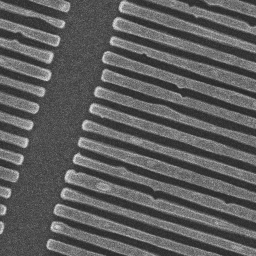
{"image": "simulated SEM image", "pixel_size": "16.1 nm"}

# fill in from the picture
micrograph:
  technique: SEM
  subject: parallel lines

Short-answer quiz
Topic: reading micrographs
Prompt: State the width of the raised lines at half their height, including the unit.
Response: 0.146 microns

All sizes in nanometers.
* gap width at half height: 144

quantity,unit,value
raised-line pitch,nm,286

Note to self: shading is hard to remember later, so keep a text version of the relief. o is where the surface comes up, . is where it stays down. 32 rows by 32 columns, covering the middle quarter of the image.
.............oooooooo.......oooo
..........o.....oooooooo.......o
..........oooo.....ooooooooo....
..........ooooooo......oooooooo.
...........ooooooooo......oooooo
..............ooooooooo.....oooo
........ooo......ooooooooo......
........oooooo......ooooooooo...
..........ooooooo......ooooooooo
.............ooooooo.......ooooo
.......oo.......ooooooooo.....oo
.......ooooo.......oooooooo.....
........ooooooo.......ooooooo...
..........ooooooooo.......oooooo
..............oooooooo.......ooo
.....oooo........oooooooo.......
.......ooooo........oooooooo....
..........oooooo.......oooooooo.
.............oooooo.......oooooo
....oooo........oooooo.......ooo
.....oooooo........oooooo.......
.......oooooooo.......oooooo....
..........oooooooo.......ooooooo
...ooo.......ooooooooo......oooo
...oooooo......oooooooooo......o
.....ooooooo.......ooooooooo....
........oooooooo.....oooooooooo.
.oooo......ooooooo......oooooooo
.ooooooo......ooooooo......ooooo
.oooooooooo.......oooooo.......o
....oooooooooo.......ooooooo....
o......oooooooooo......ooooooooo